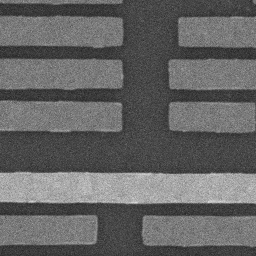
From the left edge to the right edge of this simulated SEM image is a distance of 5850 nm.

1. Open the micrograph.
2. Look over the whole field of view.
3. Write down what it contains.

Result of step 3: groups of lines, slits or small figures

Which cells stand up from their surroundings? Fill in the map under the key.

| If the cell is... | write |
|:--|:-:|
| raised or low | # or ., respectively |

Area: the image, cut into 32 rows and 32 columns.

................................
................................
###############........#########
###############.......##########
###############.......##########
###############........#########
................................
###.............................
###############......###########
###############......###########
###############......###########
................................
................................
###############......###########
###############......###########
###############......###########
............................###.
................................
................................
................................
................................
................................
################################
################################
################################
................................
................................
############......##############
############......##############
############......##############
##..##............##############
................................